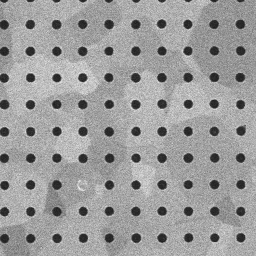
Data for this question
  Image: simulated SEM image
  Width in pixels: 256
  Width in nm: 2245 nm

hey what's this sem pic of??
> a regular array of holes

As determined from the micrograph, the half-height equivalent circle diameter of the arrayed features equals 85.7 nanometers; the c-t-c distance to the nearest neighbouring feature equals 228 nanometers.